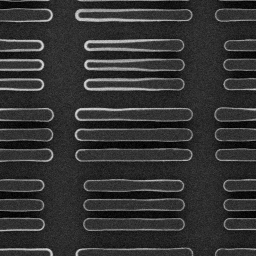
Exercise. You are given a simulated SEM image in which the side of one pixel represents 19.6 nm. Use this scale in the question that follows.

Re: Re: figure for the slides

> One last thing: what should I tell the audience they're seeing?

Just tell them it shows groups of lines, slits or small figures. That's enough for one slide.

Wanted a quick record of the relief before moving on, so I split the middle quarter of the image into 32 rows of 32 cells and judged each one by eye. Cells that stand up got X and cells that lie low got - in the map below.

-----XXXXXXXXXXXXXXXXXXXXXXXXX--
-------------------XXXXXXXXXX---
--------------------------------
--------------------------------
-----XXXXXXXXXXXXXXXXXXXXXXXXX--
-----XXXXXXXXXXXXXXXXXXXXXXXXX--
--------------------------------
--------------------------------
--------------------------------
--------------------------------
--------------------------------
----XXXXXXXXXXXXXXXXXXXXXXXXXXXX
---XXXXXXXXXXXXXXXXXXXXXXXXXXXXX
---XXXXXXXXXXXXXXXXXXXXXXXXXXXXX
--------------------------------
--------------------------------
----XXXXXXXXXXXXXXXXXXXXXXXXXXX-
---XXXXXXXXXXXXXXXXXXXXXXXXXXXXX
---XXXXXXXXXXXXXXXXXXXXXXXXXXXXX
--------------------------------
--------------------------------
----XXXXXXXXXXXXXXXXXXXXXXXXXXX-
---XXXXXXXXXXXXXXXXXXXXXXXXXXXXX
---XXXXXXXXXXXXXXXXXXXXXXXXXXXXX
--------------------------------
--------------------------------
--------------------------------
--------------------------------
--------------------------------
-----XXXXXXXXXXXXXXXXXXXXXXXXX--
-----XXXXXXXXXXXXXXXXXXXXXXXXX--
------XXXXXXXXXXXXXXXXXXXXXXX---